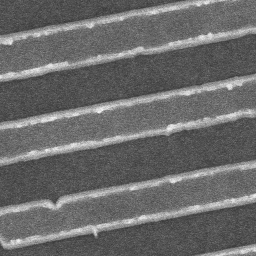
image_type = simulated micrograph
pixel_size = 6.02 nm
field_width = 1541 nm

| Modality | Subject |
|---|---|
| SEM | one or a few lines or trenches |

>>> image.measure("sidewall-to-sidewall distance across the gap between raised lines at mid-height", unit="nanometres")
268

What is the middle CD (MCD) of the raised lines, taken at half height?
228 nanometres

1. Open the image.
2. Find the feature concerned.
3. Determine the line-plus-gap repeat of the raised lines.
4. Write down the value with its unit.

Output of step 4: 83.7 pixels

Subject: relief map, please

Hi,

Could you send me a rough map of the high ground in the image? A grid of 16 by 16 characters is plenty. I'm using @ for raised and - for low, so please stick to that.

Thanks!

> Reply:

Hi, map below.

----------@@@@@@
-----@@@@@@@@@@@
@@@@@@@@@@@@@---
@@@@@@@@--------
@@@-------------
------------@@@@
-------@@@@@@@@@
--@@@@@@@@@@@@--
@@@@@@@@@-------
@@@-------------
--------------@@
---------@@@@@@@
----@@@@@@@@@@@@
@@@@@@@@@@@-----
@@@@@@----------
---------------@